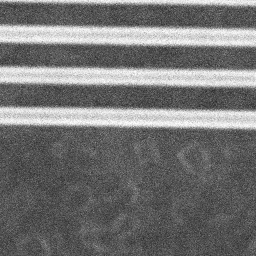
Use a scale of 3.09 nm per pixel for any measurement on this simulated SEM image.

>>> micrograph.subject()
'parallel lines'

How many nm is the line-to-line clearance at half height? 79.9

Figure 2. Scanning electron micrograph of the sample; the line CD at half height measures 0.0456 um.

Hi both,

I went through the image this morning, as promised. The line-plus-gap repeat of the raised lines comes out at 126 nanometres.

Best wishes